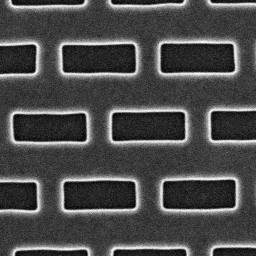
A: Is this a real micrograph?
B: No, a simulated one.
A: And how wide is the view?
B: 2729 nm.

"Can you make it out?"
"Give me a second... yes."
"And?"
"groups of lines, slits or small figures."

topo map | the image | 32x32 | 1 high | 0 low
10000000001111000000001111100000
11111111111111111111111111111111
11111111111111111111111111111111
11111111111111111111111111111111
11111111111111111111111111111111
11001111000000000111000000000111
00000111000000000111000000000111
00000111000000000111000000000111
00000111000000000111000000000111
11111111111111111111111111111111
11111111111111111111111111111111
11111111111111111111111111111111
11111111111111111111111111111111
11111111111111111111111111111111
11000000000111000000000111000000
10000000000111000000000111000000
11000000000111000000000111000000
11000000000111000000000111100000
11111111111111111111111111111111
11111111111111111111111111111111
11111111111111111111111111111111
11111111111111111111111111111111
11111111111100011111100000000111
00000111000000000111000000000011
00000111000000000111000000000011
00000111000000000111000000000111
11111111111111111111111111111111
11111111111111111111111111111111
11111111111111111111111111111111
11111111111111111111111111111111
11111111111111111111111111111111
11000000000111000000000111100000